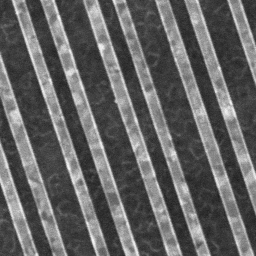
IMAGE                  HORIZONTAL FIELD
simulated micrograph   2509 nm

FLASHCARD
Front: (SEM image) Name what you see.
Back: parallel lines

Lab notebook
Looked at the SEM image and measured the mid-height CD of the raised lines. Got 120 nm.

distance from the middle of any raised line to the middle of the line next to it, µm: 0.333